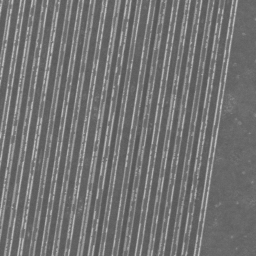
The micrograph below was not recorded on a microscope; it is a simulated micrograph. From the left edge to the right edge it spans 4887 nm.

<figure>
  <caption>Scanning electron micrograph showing parallel lines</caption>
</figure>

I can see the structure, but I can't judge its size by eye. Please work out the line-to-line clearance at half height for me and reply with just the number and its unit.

0.127 micrometres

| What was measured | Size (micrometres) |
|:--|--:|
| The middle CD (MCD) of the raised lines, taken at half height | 0.0896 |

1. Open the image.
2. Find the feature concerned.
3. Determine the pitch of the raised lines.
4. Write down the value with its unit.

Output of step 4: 223 nanometers